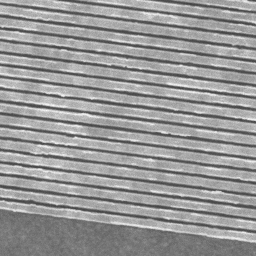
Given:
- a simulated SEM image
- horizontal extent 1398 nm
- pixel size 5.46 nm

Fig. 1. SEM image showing parallel lines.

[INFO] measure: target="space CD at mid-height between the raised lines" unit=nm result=20.3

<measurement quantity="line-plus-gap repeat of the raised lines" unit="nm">66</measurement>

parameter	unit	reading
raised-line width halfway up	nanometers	44.7